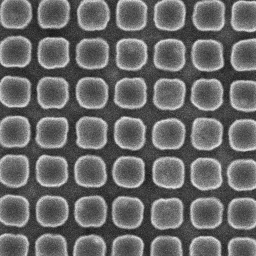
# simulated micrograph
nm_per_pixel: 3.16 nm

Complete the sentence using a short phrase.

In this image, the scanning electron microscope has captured a regular array of raised bodies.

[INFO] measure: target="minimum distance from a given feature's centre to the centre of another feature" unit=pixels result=38.4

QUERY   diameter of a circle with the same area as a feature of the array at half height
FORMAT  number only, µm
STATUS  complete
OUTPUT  0.102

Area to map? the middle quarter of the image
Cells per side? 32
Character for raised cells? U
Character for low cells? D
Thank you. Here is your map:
DDDDUUUUUUDDDUUUUUUUDDDUUUUUUUDD
DDDDDDDDDDDDDDDDDDDDDDDDDDUUDDDD
DDDDDDDDDDDDDDDDDDDDDDDDDDDDDDDD
DDDDDDDDDDDDDDDDDDDDDDDDDDDDDDDD
UDDDUUUUUUDDDUUUUUUUDDDUUUUUUUDD
UDDUUUUUUUUDDUUUUUUUUDDUUUUUUUDD
UDDUUUUUUUUDDUUUUUUUUDDUUUUUUUDD
UDDUUUUUUUUDDUUUUUUUUDDUUUUUUUDD
UDDUUUUUUUUDDUUUUUUUUDUUUUUUUUDD
DDDDUUUUUUDDDUUUUUUUDDDUUUUUUUDD
DDDDDUUUUUDDDDUUUUUDDDDUUUUUUDDD
DDDDDDDDDDDDDDDDDDDDDDDDDDDDDDDD
DDDDDDDDDDDDDDDDDDDDDDDDDDDDDDDD
DDDDDUUUDDDDDDDUDDDDDDDDDDDDDDDD
UDDUUUUUUUDDDUUUUUUDDDDUUUUUUDDD
UDDUUUUUUUUDDUUUUUUUDDDUUUUUUUDD
UDDUUUUUUUUDDUUUUUUUDDUUUUUUUUDD
UDDUUUUUUUDDDUUUUUUUDDUUUUUUUUDD
UDDDUUUUUUDDDUUUUUUUDDUUUUUUUUDD
DDDUUUUUUUDDDUUUUUUUDDUUUUUUUUDD
DDDDUUUUUUDDDDUUUUUDDDDUUUUUUDDD
DDDDDDDDDDDDDDDDDUDDDDDDDDDDDDDD
DDDDDDDDDDDDDDDDDDDDDDDDDDDDDDDD
DDDDUUUUUDDDDDUUUUDDDDDDDUUDDDDD
DDDUUUUUUUDDDUUUUUUUDDDUUUUUUUDD
UDDUUUUUUUDDDUUUUUUUDDUUUUUUUUDD
UDDUUUUUUUDDUUUUUUUUDDUUUUUUUUDD
UDDUUUUUUUUDUUUUUUUUDDUUUUUUUUDD
UDDUUUUUUUUDUUUUUUUUDDUUUUUUUUDD
DDDUUUUUUUDDDUUUUUUUDDDUUUUUUUDD
DDDDDUUUUDDDDDUUUUDDDDDDUUUUUDDD
DDDDDDDDDDDDDDDDDDDDDDDDDDDDDDDD